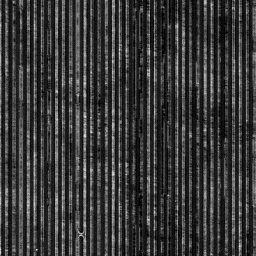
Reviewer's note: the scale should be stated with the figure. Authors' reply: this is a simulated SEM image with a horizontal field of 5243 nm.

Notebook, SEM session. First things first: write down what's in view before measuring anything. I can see parallel lines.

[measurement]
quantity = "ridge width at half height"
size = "41 nm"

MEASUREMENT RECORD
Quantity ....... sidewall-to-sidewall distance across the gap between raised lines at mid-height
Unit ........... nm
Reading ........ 99.8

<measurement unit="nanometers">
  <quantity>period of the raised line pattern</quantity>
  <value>145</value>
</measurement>